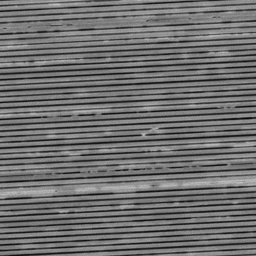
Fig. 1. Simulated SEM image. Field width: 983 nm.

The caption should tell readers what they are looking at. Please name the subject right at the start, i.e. parallel lines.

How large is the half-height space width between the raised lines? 0.0077 µm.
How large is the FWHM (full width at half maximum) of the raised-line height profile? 3.98 pixels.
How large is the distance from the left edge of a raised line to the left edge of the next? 5.68 px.